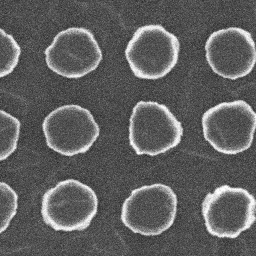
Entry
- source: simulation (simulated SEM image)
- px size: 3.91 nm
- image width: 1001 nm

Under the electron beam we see raised bodies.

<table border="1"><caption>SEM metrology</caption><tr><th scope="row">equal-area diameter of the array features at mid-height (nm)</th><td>202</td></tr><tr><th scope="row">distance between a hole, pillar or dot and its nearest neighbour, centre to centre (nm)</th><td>296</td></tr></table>